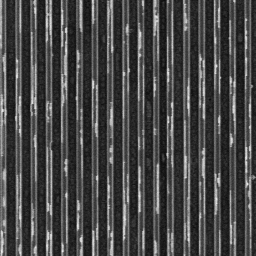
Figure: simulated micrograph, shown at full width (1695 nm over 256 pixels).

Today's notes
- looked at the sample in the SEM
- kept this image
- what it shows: parallel lines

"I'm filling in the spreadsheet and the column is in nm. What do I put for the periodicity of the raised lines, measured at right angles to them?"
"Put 101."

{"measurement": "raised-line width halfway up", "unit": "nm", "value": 38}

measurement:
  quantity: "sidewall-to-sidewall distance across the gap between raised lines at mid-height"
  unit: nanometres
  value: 63.7